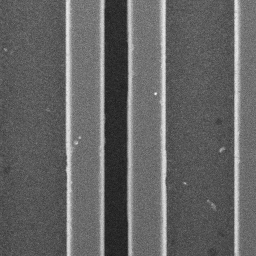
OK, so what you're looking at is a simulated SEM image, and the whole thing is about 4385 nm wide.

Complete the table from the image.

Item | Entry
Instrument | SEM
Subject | lines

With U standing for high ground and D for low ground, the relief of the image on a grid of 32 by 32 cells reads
DDDDDDDDUUUUUDDDUUUUUDDDDDDDDUUU
DDDDDDDDUUUUUDDDUUUUUDDDDDDDDUUU
DDDDDDDDUUUUUDDDUUUUUDDDDDDDDUUU
DDDDDDDDUUUUUDDDUUUUUDDDDDDDDUUU
DDDDDDDDUUUUUDDDUUUUUDDDDDDDDUUU
DDDDDDDDUUUUUDDDUUUUUDDDDDDDDUUU
DDDDDDDDUUUUUDDDUUUUUDDDDDDDDUUU
DDDDDDDDUUUUUDDDUUUUUDDDDDDDDUUU
DDDDDDDDUUUUUDDDUUUUUDDDDDDDDUUU
DDDDDDDDUUUUUDDDUUUUUDDDDDDDDUUU
DDDDDDDDUUUUUDDDUUUUUDDDDDDDDUUU
DDDDDDDDUUUUUDDDUUUUUDDDDDDDDUUU
DDDDDDDDUUUUUDDDUUUUUDDDDDDDDUUU
DDDDDDDDUUUUUDDDUUUUUDDDDDDDDUUU
DDDDDDDDUUUUUDDDUUUUUDDDDDDDDUUU
DDDDDDDDUUUUUDDDUUUUUDDDDDDDDUUU
DDDDDDDDUUUUUDDDUUUUUDDDDDDDDUUU
DDDDDDDDUUUUUDDDUUUUUDDDDDDDDUUU
DDDDDDDDUUUUUDDDUUUUUDDDDDDDDUUU
DDDDDDDDUUUUUDDDUUUUUDDDDDDDDUUU
DDDDDDDDUUUUUDDDUUUUUDDDDDDDDUUU
DDDDDDDDUUUUUDDDUUUUUDDDDDDDDUUU
DDDDDDDDUUUUUDDDUUUUUDDDDDDDDUUU
DDDDDDDDUUUUUDDDUUUUUDDDDDDDDUUU
DDDDDDDDUUUUUDDDUUUUUDDDDDDDDUUU
DDDDDDDDUUUUUDDDUUUUUDDDDDDDDUUU
DDDDDDDDUUUUUDDDUUUUUDDDDDDDDUUU
DDDDDDDDUUUUUDDDUUUUUDDDDDDDDUUU
DDDDDDDDUUUUUDDDUUUUUDDDDDDDDUUU
DDDDDDDDUUUUUDDDUUUUUDDDDDDDDUUU
DDDDDDDDUUUUUDDDUUUUUDDDDDDDDUUU
DDDDDDDDUUUUUDDDUUUUUDDDDDDDDUUU